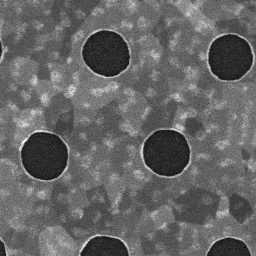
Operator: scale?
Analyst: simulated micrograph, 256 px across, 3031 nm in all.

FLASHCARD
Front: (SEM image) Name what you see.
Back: holes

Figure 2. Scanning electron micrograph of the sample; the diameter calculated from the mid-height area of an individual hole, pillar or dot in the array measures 565 nm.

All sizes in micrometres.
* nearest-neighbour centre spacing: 1.37